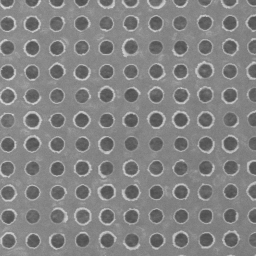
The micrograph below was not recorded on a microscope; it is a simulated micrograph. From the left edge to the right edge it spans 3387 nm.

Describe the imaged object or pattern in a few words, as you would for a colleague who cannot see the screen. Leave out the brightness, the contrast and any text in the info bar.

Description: a regular array of holes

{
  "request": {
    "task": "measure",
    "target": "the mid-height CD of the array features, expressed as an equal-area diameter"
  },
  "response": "182 nanometers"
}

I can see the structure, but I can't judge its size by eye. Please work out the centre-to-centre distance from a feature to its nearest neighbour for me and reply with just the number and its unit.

0.316 micrometres